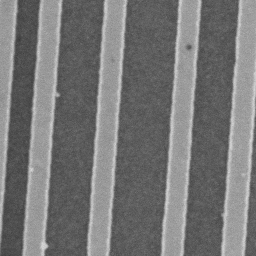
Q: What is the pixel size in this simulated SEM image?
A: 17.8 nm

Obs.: lines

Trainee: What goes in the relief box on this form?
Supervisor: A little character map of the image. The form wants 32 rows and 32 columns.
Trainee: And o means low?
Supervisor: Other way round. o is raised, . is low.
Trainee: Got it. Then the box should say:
oo...ooo.....ooo......ooo.....oo
oo...ooo.....ooo......ooo.....oo
oo...ooo.....ooo......ooo.....oo
oo...oo......ooo......ooo.....oo
oo...oo......oo.......ooo.....oo
oo...oo......oo.......ooo.....oo
oo...oo......oo.......ooo.....oo
oo...oo......oo.......oo......oo
oo...oo......oo.......oo.....ooo
o...ooo.....ooo.......oo.....ooo
o...ooo.....ooo.......oo.....ooo
o...ooo.....ooo.......oo.....ooo
o...ooo.....ooo.......oo.....ooo
o...ooo.....ooo......ooo.....ooo
o...ooo.....ooo......ooo.....ooo
o...ooo.....ooo......ooo.....ooo
o...oo......ooo......ooo.....ooo
o...oo......ooo......ooo.....oo.
o...oo......ooo......ooo.....oo.
o...oo......oo.......ooo.....oo.
o...oo......oo.......ooo.....oo.
o...oo......oo.......ooo....ooo.
o...oo......oo.......oo.....ooo.
...ooo......oo.......oo.....ooo.
...ooo......oo.......oo.....ooo.
...ooo......oo.......oo.....ooo.
...ooo.....ooo.......oo.....ooo.
...ooo.....ooo.......oo.....ooo.
...ooo.....ooo......ooo.....ooo.
...ooo.....ooo......ooo.....ooo.
...ooo.....ooo......ooo.....ooo.
...ooo.....ooo......ooo.....ooo.